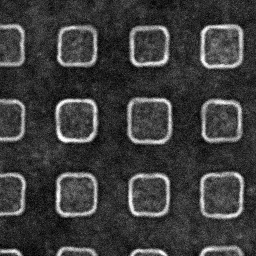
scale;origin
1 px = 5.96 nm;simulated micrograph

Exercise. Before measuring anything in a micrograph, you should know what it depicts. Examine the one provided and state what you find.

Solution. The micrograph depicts a regular array of raised bodies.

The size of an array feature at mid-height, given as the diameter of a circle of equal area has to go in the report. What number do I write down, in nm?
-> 259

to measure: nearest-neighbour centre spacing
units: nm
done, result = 432